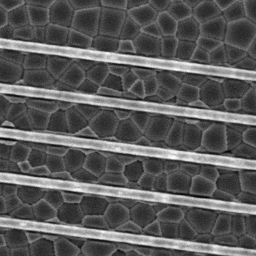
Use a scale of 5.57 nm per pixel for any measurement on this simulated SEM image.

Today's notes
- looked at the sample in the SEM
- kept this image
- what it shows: parallel lines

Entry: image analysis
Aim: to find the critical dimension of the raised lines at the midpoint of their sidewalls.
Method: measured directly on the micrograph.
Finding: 8.82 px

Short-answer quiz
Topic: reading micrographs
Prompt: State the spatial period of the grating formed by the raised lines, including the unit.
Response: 246 nanometres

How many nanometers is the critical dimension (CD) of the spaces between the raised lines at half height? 198